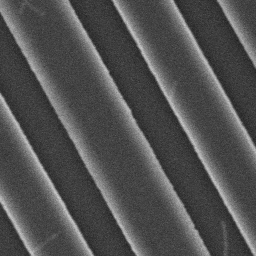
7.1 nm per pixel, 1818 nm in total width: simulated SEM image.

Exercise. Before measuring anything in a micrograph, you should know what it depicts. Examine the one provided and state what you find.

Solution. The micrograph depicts lines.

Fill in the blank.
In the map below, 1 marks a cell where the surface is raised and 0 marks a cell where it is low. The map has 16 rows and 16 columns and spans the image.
1111000111100011
1111100011110011
0111110011110001
0011110001111000
0011111000111000
0001111000111100
0001111100011100
1000111100011110
1100111110001111
1100011111001111
1110011111000111
1110001111100111
1111000111100011
0111000111110001
0111100011110001
0011110011111000